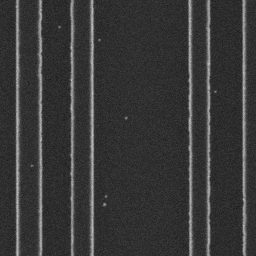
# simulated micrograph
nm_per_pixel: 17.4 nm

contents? lines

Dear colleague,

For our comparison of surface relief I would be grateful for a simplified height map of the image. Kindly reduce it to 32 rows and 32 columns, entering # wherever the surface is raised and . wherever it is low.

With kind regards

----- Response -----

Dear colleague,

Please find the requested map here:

..###....##.............##....##
..###....##.............##....##
..###....##.............##.....#
..###....##.............##....##
..###....##.............##.....#
..###....##.............##.....#
..###....##.............##.....#
..###....##.............##.....#
..###....##.............##.....#
..###....##.............##.....#
..###....##.............##.....#
..###....##.............##.....#
..###....##.............##.....#
..###....##.............##.....#
..###....##.............##.....#
..###....##.............##.....#
..###....##.............##.....#
..###....##.............##.....#
..###....##.............##.....#
..###....##.............##.....#
..###....##.............##.....#
..###....##.............##.....#
..###....##.............##.....#
..###....##.............##.....#
..###....##.............##.....#
..###....###............##.....#
..###....##.............##.....#
..###....##.............##.....#
..###....##.............##.....#
..###....##.............##.....#
..###....###............##.....#
..###....##.............##.....#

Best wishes